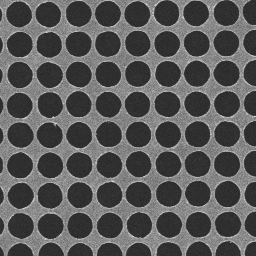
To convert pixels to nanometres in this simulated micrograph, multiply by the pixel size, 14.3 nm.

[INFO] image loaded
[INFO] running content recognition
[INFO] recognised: a regular array of holes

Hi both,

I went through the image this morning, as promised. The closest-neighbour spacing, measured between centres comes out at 420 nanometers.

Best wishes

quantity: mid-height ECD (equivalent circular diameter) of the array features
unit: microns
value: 0.366